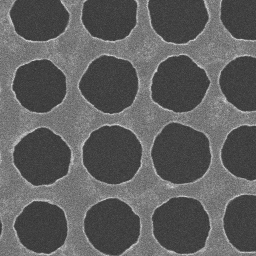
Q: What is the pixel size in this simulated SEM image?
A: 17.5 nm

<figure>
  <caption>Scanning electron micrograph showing a regular array of holes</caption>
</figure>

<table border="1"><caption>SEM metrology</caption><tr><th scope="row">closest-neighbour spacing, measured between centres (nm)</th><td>1220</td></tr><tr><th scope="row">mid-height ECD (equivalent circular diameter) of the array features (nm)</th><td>998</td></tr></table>